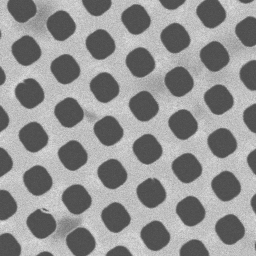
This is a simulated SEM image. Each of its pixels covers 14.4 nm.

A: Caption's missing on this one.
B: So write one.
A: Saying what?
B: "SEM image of a regular array of holes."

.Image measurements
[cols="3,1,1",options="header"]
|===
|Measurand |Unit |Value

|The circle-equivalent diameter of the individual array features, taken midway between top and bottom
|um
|0.418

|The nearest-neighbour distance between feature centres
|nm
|622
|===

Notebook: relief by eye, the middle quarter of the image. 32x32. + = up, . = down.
....++++++++++++.......+++++++++
....++++++++++++......+++++....+
....+++++..++++++....+++++......
...++++.....+++++++++++++.......
..+++++......++++++++++++.......
++++++........+++++++++++.......
+++++++.......++++++++++++......
+++++++.......++++....+++++....+
+.++++++.....++++......+++++++++
...++++++..+++++.......+++++++++
....++++++++++++........++++++++
.....++++++++++++.......+++++..+
.....++++++++++++......++++.....
.....+++++...+++++....++++......
....++++......++++++++++++......
...+++++......++++++++++++......
+++++++........++++++++++++.....
++++++++.......+++++.++++++.....
++++++++......+++++....+++++...+
+...+++++....+++++......++++++++
....+++++++++++++.......++++++++
.....++++++++++++........+++++++
......++++++++++++.......+++++..
......++++++++++++......++++....
......++++....+++++....++++.....
.....++++......++++++++++++.....
+..+++++.......++++++++++++.....
++++++++........++++++++++++....
+++++++++.......++++++++++++....
+++++++++......+++++....+++++...
+....+++++....++++.......+++++++
......++++++++++++.......+++++++